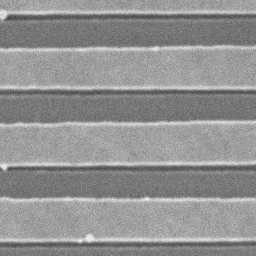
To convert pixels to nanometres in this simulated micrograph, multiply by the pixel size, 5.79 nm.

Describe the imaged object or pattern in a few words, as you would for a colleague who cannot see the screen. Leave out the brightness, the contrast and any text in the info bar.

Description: lines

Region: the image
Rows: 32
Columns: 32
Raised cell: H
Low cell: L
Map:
HHHHHHHHHHHHHHHHHHHHHHHHHHHHHHHH
HHHHHHHHHHHHHHHHHHHHHHHHHHHHHHHH
LLLLLLLLLLLLLLLLLLLLLLLLLLLLLLLL
LLLLLLLLLLLLLLLLLLLLLLLLLLLLLLLL
LLLLLLLLLLLLLLLLLLLLLLLLLLLLLLLL
LLLLLLLLLLLLLLLLLLLLLLLLLLLLLLLL
HHHHHHHHHHHHHHHHHHHHHHHHHHHHHHHH
HHHHHHHHHHHHHHHHHHHHHHHHHHHHHHHH
HHHHHHHHHHHHHHHHHHHHHHHHHHHHHHHH
HHHHHHHHHHHHHHHHHHHHHHHHHHHHHHHH
HHHHHHHHHHHHHHHHHHHHHHHHHHHHHHHH
LLLLLLLLLLLLLLLLLLLLLLLLLLLLLLLL
LLLLLLLLLLLLLLLLLLLLLLLLLLLLLLLL
LLLLLLLLLLLLLLLLLLLLLLLLLLLLLLLL
LLLLLLLLLLLLLLLLLLLLLLLLLLLLLLLL
LLHLHLLHHHHHHHHHHHHHHHHHHHHHHHHH
HHHHHHHHHHHHHHHHHHHHHHHHHHHHHHHH
HHHHHHHHHHHHHHHHHHHHHHHHHHHHHHHH
HHHHHHHHHHHHHHHHHHHHHHHHHHHHHHHH
HHHHHHHHHHHHHHHHHHHHHHHHHHHHHHHH
HHHHHHHHHHHHHHHHHHHHHHHHHHHHHHHL
LLLLLLLLLLLLLLLLLLLLLLLLLLLLLLLL
LLLLLLLLLLLLLLLLLLLLLLLLLLLLLLLL
LLLLLLLLLLLLLLLLLLLLLLLLLLLLLLLL
LLLLLLLLLLLLLLLLLLLLLLLLLLLLLLLL
HHHHHHHHHHHHHHHHHHHHHHHHHHHHHHHH
HHHHHHHHHHHHHHHHHHHHHHHHHHHHHHHH
HHHHHHHHHHHHHHHHHHHHHHHHHHHHHHHH
HHHHHHHHHHHHHHHHHHHHHHHHHHHHHHHH
HHHHHHHHHHHHHHHHHHHHHHHHHHHHHHHH
LLLLLLLLLLLLLLLLLLLLLLLLLLLLLLLL
LLLLLLLLLLLLLLLLLLLLLLLLLLLLLLLL